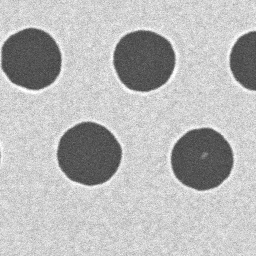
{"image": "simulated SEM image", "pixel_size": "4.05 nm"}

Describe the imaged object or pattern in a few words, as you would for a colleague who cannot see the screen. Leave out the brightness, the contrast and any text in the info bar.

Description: holes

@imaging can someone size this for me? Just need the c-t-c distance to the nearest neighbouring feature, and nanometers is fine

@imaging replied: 444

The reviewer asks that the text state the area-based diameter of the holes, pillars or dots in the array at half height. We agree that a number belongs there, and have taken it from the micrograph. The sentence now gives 63 px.